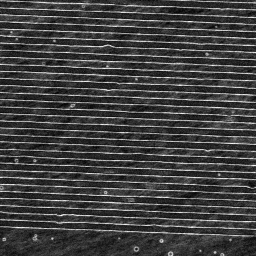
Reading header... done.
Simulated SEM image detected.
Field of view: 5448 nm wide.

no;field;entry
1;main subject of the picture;parallel lines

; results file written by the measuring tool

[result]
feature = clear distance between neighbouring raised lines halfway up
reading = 138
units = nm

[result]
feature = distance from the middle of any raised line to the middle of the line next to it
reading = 0.3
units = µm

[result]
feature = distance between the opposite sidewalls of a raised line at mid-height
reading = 167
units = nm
